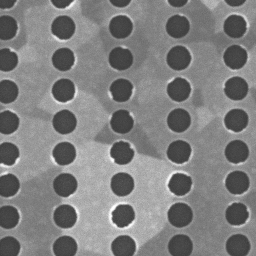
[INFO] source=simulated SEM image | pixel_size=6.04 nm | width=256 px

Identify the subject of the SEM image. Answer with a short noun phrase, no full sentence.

a regular array of holes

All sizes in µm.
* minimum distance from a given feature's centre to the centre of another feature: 0.189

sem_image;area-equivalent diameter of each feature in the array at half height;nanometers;148